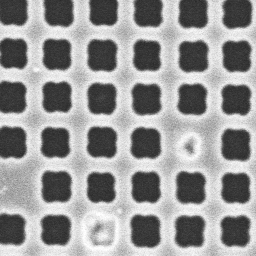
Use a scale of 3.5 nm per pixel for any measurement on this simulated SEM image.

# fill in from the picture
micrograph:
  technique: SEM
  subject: a regular array of holes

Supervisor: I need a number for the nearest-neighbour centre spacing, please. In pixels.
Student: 43.2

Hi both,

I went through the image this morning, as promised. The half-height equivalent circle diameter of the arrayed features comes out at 114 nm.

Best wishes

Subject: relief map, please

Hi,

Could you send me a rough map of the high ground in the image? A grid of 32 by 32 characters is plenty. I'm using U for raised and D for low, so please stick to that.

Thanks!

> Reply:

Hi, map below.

DDDUUDDDDUUDDDDUUDDDUUDDDDUUDDDU
DDDUUUDDDUUDDDDUUDDDUUDDDDUUDDDU
DDDUUUDDDUUDDDDUUDDDUUDDDDUUDDDU
UUUUUUUUUUUUUUUUUUUUUUUUUUUUDDUU
UUUUUUUUUUUUUUUUUUUUUUUUUUUUUUUU
DDDUUDDDDUUDDDUUUDDDUUUDDDUUDDDU
DDDUUDDDDUUDDDDUUDDDUUDDDDUUDDDU
DDDUUDDDDUUDDDDUUDDDUUDDDDUUDDDU
UDDUUUDDUUUDDDUUUDDDUUUDDDUUDDDU
UUUUUUUUUUUUUUUUUUUUUUUUUUUUUUUU
DDDUUUDDDUUUDDUUUDUUUUUDDUUUUUUU
DDDUUDDDDUUDDDDUDDDDUUDDDDUUDDDU
DDDUUDDDDUUDDDUUDDDDUUDDDDUUDDDU
DDDUUDDDDUUDDDUUUDDDUUDDDDUUDDDU
UUUUUUUUUUUUUUUUUUUUUUUUUUUUUUUU
UUUUUUUUUUUUUUUUUUUUUUUUUUUUUUUU
DDDUUDDDUUUDDDUUUDDDUUUUUUUUDDDU
DDDUUDDDDUUDDDDUDDDDUUUUUUUUDDDU
DDDUUDDDDUUDDDDUDDDDUUUUUUUUDDDU
DDDUUUDDUUUDDDUUUDDDUUUUUUUUDDDU
UUUUUUUUUUUUUUUUUUUUUUUUUUUUUUUU
UUUUUUDDUUUUUUUUUDDUUUUUUUUUUUUU
UUUUUDDDDUUDDDUUDDDDUUDDDDUUDDDU
UUUUUDDDDUUDDDUUDDDDUUDDDDUUDDDU
UUUUUDDDDUUDDDUUDDDDUUDDDDUUDDDU
UUUUUUUUUUUUUUUUUUUUUUUUDUUUUUUU
UUUUUUUUUUUUUUUUUUUUUUUUUUUUUUUU
DDDUUDDDDUUUUUUUDDDDUUDDDUUUDDDU
DDDUUDDDDUUUUUUUDDDDUUDDDDUUDDDU
DDDUUDDDDUUUUUUUDDDDUUDDDUUUDDDU
DDDUUUDDUUUUUUUUUDDDUUDDDUUUDDDU
UUUUUUUUUUUUUUUUUUUUUUUUUUUUUUUU